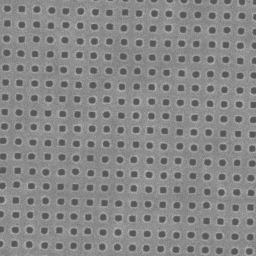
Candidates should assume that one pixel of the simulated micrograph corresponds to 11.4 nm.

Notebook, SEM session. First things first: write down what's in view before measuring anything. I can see a regular array of holes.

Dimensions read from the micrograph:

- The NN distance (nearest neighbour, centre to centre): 0.16 micrometres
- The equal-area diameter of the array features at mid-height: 0.0803 microns